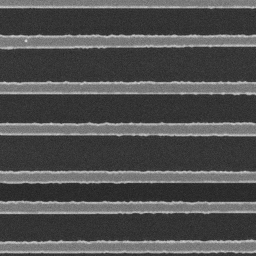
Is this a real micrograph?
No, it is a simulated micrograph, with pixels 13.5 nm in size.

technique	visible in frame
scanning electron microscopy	lines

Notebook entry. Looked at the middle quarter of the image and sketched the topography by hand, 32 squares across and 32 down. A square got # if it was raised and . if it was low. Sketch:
................................
................................
................................
................................
#....#...##.#.#..#####.....#.#.#
################################
################################
................................
................................
................................
................................
................................
................................
................................
................................
################################
################################
################################
................................
................................
................................
................................
................................
................................
................................
................................
................................
################################
################################
################################
................................
................................